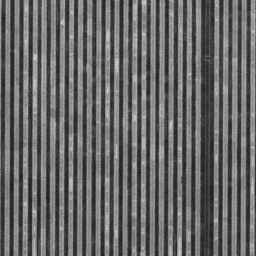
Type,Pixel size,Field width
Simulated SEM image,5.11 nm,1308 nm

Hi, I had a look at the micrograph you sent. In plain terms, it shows parallel lines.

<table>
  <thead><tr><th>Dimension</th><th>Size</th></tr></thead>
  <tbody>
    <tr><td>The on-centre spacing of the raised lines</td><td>46.4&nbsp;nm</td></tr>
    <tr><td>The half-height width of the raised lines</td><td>23.6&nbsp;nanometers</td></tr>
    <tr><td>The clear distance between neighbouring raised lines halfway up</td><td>23.6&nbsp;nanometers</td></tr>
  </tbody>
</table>